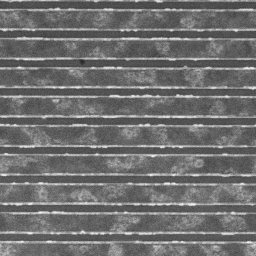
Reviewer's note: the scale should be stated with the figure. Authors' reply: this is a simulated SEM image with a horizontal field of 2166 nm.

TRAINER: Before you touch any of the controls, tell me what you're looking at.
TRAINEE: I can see parallel lines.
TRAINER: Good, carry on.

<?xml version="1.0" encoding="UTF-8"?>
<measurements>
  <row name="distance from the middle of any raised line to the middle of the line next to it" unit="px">29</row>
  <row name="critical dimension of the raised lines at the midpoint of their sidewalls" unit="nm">178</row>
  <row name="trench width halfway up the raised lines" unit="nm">68.7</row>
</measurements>